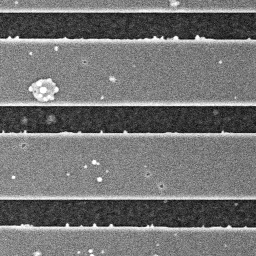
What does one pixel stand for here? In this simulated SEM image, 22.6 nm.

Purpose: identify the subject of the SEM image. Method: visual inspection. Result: lines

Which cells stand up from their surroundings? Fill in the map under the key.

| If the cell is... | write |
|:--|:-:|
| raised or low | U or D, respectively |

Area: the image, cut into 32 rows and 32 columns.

UUUUUUUUUUUUUUUUUUUUUUUUUUUUUUUU
DDDDDDDDDDDDDDDDDDDDDDDDDDDDDDDD
DDDDDDDDDDDDDDDDDDDDDDDDDDDDDDDD
DDDDDDDDDDDDDDDDDDDDDDDDDDDDDDDD
DDDDDDDDDDDDDDDDDDDDDDDDDDDDDDDD
UUUUUUUUUUUUUUUUUUUUUUUUUUUUUUUU
UUUUUUUUUUUUUUUUUUUUUUUUUUUUUUUU
UUUUUUUUUUUUUUUUUUUUUUUUUUUUUUUU
UUUUUUUUUUUUUUUUUUUUUUUUUUUUUUUU
UUUUUUUUUUUUUUUUUUUUUUUUUUUUUUUU
UUUUUUUUUUUUUUUUUUUUUUUUUUUUUUUU
UUUUUUUUUUUUUUUUUUUUUUUUUUUUUUUU
UUUUUUUUUUUUUUUUUUUUUUUUUUUUUUUU
DDDDDDDDDDDDDDDDDDDDDDDDDDDDDDDD
DDDDDDDDDDDDDDDDDDDDDDDDDDDDDDDD
DDDDDDDDDDDDDDDDDDDDDDDDDDDDDDDD
DDDDDDDDDDDDDDDDDDDDDDDDDDDDDDDD
UUUUUUUUUUUUUUUUUUUUUUUUUUUUUUUU
UUUUUUUUUUUUUUUUUUUUUUUUUUUUUUUU
UUUUUUUUUUUUUUUUUUUUUUUUUUUUUUUU
UUUUUUUUUUUUUUUUUUUUUUUUUUUUUUUU
UUUUUUUUUUUUUUUUUUUUUUUUUUUUUUUU
UUUUUUUUUUUUUUUUUUUUUUUUUUUUUUUU
UUUUUUUUUUUUUUUUUUUUUUUUUUUUUUUU
UUUUUUUUUUUUUUUUUUUUUUUUUUUUUUUU
DDDDDDDDDDDDDDDDDDDDDDDDDDDDDDDD
DDDDDDDDDDDDDDDDDDDDDDDDDDDDDDDD
DDDDDDDDDDDDDDDDDDDDDDDDDDDDDDDD
UUUUUUUUUUUUUUUUUUUUUDDDDDUUDDDD
UUUUUUUUUUUUUUUUUUUUUUUUUUUUUUUU
UUUUUUUUUUUUUUUUUUUUUUUUUUUUUUUU
UUUUUUUUUUUUUUUUUUUUUUUUUUUUUUUU